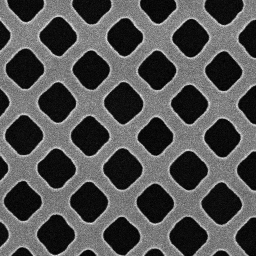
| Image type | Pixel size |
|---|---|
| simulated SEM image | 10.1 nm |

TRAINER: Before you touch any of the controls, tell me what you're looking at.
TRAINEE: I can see a regular array of holes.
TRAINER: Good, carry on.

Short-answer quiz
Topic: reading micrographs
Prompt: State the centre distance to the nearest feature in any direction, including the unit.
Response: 46.6 pixels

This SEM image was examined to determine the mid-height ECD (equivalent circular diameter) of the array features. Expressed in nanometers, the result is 359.